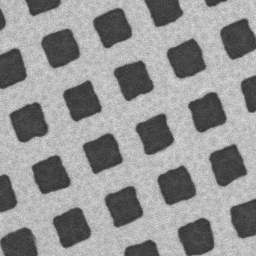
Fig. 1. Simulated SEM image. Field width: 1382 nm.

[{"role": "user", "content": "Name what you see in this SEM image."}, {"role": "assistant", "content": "a regular array of holes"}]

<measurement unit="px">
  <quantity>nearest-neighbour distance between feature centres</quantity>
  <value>55.9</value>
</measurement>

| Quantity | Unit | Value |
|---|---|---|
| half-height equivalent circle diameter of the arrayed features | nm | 196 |